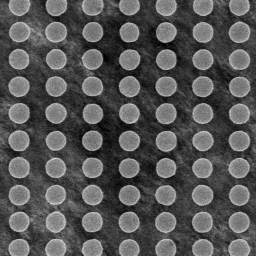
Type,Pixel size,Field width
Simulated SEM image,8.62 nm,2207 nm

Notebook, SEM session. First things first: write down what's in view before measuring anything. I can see a regular array of raised bodies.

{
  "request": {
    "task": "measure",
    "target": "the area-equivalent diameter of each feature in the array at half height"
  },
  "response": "0.174 µm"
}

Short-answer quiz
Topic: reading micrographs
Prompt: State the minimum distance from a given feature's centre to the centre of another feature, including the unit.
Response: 233 nm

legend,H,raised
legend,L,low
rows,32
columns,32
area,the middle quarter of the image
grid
LLLLLHHHHLLLLLHHHHLLLLLLHHHHLLLL
LLLLLLLLLLLLLLLLLLLLLLLLLLLLLLLL
LLLLLLLLLLLLLLLLLLLLLLLLLLLLLLLL
LLLLLLHHLLLLLLLHHHLLLLLLHHHLLLLL
LLLLLHHHHLLLLLHHHHLLLLLHHHHHLLLL
HLLLLHHHHHLLLLHHHHHLLLLHHHHHLLLL
LLLLLHHHHHLLLLHHHHHLLLLHHHHHLLLL
LLLLLLHHHLLLLLLHHHLLLLLLHHHLLLLL
LLLLLLLLLLLLLLLLLLLLLLLLLLLLLLLL
LLLLLLLLLLLLLLLLLLLLLLLLLLLLLLLL
LLLLLLHHHLLLLLLHHHLLLLLLHHHLLLLL
LLLLLHHHHLLLLLHHHHHLLLLHHHHHLLLL
HLLLLHHHHHLLLLHHHHHLLLLHHHHHLLLL
LLLLLHHHHLLLLLHHHHLLLLLHHHHHLLLL
LLLLLLHHLLLLLLLHHHLLLLLLHHHLLLLL
LLLLLLLLLLLLLLLLLLLLLLLLLLLLLLLL
LLLLLLLLLLLLLLLLLLLLLLLLLLLLLLLL
LLLLLHHHHLLLLLHHHHLLLLLLHHHLLLLL
LLLLLHHHHLLLLLHHHHHLLLLHHHHHLLLL
LLLLLHHHHLLLLLHHHHHLLLLHHHHHLLLL
LLLLLHHHHLLLLLHHHHHLLLLHHHHHLLLL
LLLLLLHHLLLLLLLHHLLLLLLLHHHLLLLL
LLLLLLLLLLLLLLLLLLLLLLLLLLLLLLLL
LLLLLLLLLLLLLLLLLLLLLLLLLLLLLLLL
LLLLLHHHHLLLLLHHHHLLLLLLHHHLLLLL
LLLLLHHHHHLLLLHHHHHLLLLHHHHHLLLL
LLLLLHHHHHLLLLHHHHHLLLLHHHHHLLLL
LLLLLHHHHLLLLLHHHHLLLLLHHHHLLLLL
LLLLLLLLLLLLLLLLLLLLLLLLLLLLLLLL
LLLLLLLLLLLLLLLLLLLLLLLLLLLLLLLL
LLLLLLHHLLLLLLLHHLLLLLLLLHLLLLLL
LLLLLHHHHLLLLLHHHHHLLLLHHHHLLLLL